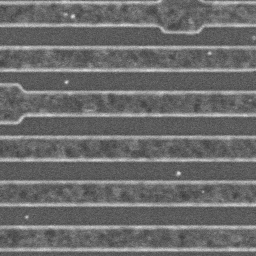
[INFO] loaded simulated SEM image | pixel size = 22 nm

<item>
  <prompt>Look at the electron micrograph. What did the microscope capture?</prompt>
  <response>wiring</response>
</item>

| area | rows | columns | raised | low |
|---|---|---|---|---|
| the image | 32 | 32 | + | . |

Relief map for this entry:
++++++++++++++++++++++++++++++++
++++++++++++++++++++++++++++++++
++++++++++++++++++++++++++++++++
....................+++++.......
................................
................................
++++++++++++++++++++++++++++++++
++++++++++++++++++++++++++++++++
++++++++++++++++++++++++++++++++
................................
................................
+++.............................
++++++++++++++++++++++++++++++++
++++++++++++++++++++++++++++++++
+++.............................
................................
................................
++++++++++++++++++++++++++++++++
++++++++++++++++++++++++++++++++
++++++++++++++++++++++++++++++++
................................
................................
................................
++++++++++++++++++++++++++++++++
++++++++++++++++++++++++++++++++
++++++++++++++++++++++++++++++++
................................
................................
++++++++++++++++++++++++++++++++
++++++++++++++++++++++++++++++++
++++++++++++++++++++++++++++++++
................................